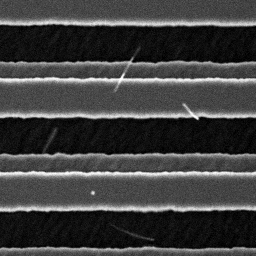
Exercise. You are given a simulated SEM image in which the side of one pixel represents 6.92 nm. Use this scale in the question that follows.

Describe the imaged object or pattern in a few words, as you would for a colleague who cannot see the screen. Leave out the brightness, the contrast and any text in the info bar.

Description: lines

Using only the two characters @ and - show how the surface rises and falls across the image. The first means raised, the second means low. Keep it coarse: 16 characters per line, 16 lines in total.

@@@@@@@@@@@@@@@@
@@@-@@@@@@@@@@@@
----------------
----------------
@@@@@@@@@@@@@@@@
@@@@@@@@@@@@@@@@
@@@@@@@@@@@@@@@@
----------------
----------------
----------------
@@@@@@@@@@@@@@@@
@@@@@@@@@@@@@@@@
@@@@@@@@@@@@@@@@
----------------
----------------
--@@@@--@@----@@